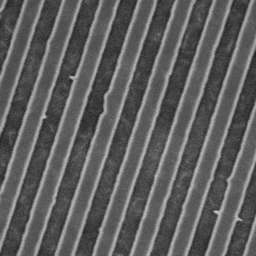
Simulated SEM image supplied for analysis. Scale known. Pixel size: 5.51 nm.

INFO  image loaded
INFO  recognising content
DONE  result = parallel lines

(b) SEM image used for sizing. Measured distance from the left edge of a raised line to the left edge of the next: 197 nm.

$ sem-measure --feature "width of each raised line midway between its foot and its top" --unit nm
93.6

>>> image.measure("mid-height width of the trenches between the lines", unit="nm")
104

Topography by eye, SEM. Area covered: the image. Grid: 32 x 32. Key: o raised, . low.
o..oo...oo..ooo..oo...oo...oo..o
...oo..ooo..oo...oo...oo..ooo..o
..ooo..oo...oo...oo..oo...oo...o
..oo...oo..ooo..oo...oo...oo..oo
..oo..ooo..oo...oo...oo..oo...oo
.ooo..oo...oo...oo..oo...oo...oo
.oo...oo...oo..oo...oo...oo..ooo
.oo..ooo..oo...oo...oo..oo...oo.
ooo..oo...oo...oo..oo...oo...oo.
oo...oo..ooo..oo...oo...oo..ooo.
oo...oo..oo...oo...oo..oo...oo..
oo..oo...oo..ooo..ooo..oo...oo..
o...oo...oo..oo...oo...oo..ooo..
o..ooo..oo...oo...oo..ooo..oo...
o..oo...oo...oo..ooo..oo...oo..o
...oo...oo..ooo..oo...oo..ooo..o
..ooo..oo...oo...oo..oo...oo...o
..oo...oo...oo..ooo..oo...oo..oo
..oo...oo..ooo..oo...oo..ooo..oo
..oo..oo...oo...oo..ooo..oo...oo
.oo...oo...oo..ooo..oo...oo..ooo
.oo...oo..ooo..oo...oo..ooo..oo.
.oo..ooo..oo...oo..ooo..oo...oo.
oo...oo...oo..ooo..oo...oo..ooo.
oo...oo..ooo..oo...oo...oo..oo..
oo..ooo..oo...oo..ooo..oo...oo..
oo..oo...oo..ooo..oo...oo..ooo..
o...oo..ooo..oo...oo..ooo..ooo..
o..ooo..oo...oo..ooo..oo...oo...
o..oo...oo..ooo..oo...oo...oo..o
...oo..ooo..oo...oo...oo..oo...o
..ooo..oo...oo..ooo..oo...oo...o